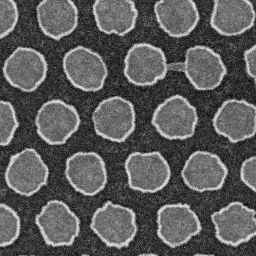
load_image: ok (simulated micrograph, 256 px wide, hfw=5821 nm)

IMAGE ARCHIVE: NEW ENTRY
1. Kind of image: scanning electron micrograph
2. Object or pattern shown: a regular array of raised bodies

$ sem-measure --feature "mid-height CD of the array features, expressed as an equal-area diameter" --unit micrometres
0.931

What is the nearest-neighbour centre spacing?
1320 nanometers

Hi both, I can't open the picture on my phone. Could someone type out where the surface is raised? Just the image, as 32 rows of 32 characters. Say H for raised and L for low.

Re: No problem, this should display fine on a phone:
HHLLLHHHHLLLHHHHLLLLHHHHLLLHHHHL
HHLLLHHHHHLLHHHHHLLHHHHHHLLHHHHH
HHLLLHHHHLLLHHHHHLLLHHHHHLLHHHHH
HLLLLHHHHLLLLHHHLLLLLHHHLLLHHHHL
LLLLLLLLLLLLLLLLLLLLLLLLLLLLLLLL
LLLLLLLLLLLLLLLLLLLLLLLLLLLLLLLL
LLHHLLLLLHHLLLLLHHHHLLLLHHLLLLLH
LHHHHLLLHHHHHLLLHHHHHLLHHHHHLLLH
LHHHHHLLHHHHHLLLHHHHHLLHHHHHLLLH
LHHHHHLLLHHHHLLLHHHHLLLLHHHHLLLL
LLHHHLLLLHHHHLLLLHLLLLLLHHHLLLLL
LLLLLLLLLLLLLLLLLLLLLLLLLLLLLLLL
LLLLLLLLLLLLLLHLLLLLLHHLLLLLLLLL
HLLLLHHHHLLLHHHHLLLLHHHHLLLLHHHH
HHLLLHHHHHLLHHHHHLLHHHHHLLLHHHHH
HHLLLHHHHHLLHHHHHLLHHHHHLLLHHHHH
HHLLLHHHHLLLHHHHLLLLHHHHLLLHHHHH
HLLLLLHHLLLLLLLLLLLLLLLLLLLLLHLL
LLLLLLLLLLLLLLLLLLLLLLLLLLLLLLLL
LLHHHLLLLHHHLLLLHHHHLLLLHHHLLLLL
LHHHHLLLLHHHHLLLHHHHHLLHHHHHLLLH
LHHHHHLLHHHHHLLLHHHHHLLHHHHHLLHH
LHHHHHLLLHHHHLLLHHHHHLLHHHHHLLLH
LLHHHLLLLLHHHLLLLHHHLLLLHHHLLLLL
LLLLLLLLLLLLLLLLLLLLLLLLLLLLLLLL
LLLLLLHHLLLLLHLLLLLLLLLLLLLLLHLL
HHLLLHHHHLLLHHHHLLLLHHHHLLLHHHHH
HHLLLHHHHHLLHHHHHLLLHHHHHLLHHHHH
HHLLLHHHHHLLHHHHHLLLHHHHHLLHHHHH
HHLLLLHHHLLLHHHHHLLLHHHHLLLHHHHL
HLLLLLLLLLLLLLHLLLLLLHLLLLLLLLLL
LLLLLLLLLLLLLLLLLLLLLLLLLLLLLLLL